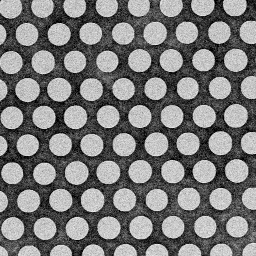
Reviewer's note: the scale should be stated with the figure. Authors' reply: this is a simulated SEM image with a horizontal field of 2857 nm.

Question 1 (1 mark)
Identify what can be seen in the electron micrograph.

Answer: an array of small figures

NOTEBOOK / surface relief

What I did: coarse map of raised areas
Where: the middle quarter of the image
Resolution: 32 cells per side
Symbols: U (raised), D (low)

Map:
UUUUUDDDUUUUUDDDUUUUUDDDUUUUUDDD
DUUUDDDDDUUUDDDDDUUUDDDDDUUUDDDD
DDDDDDDDDDDDDDDDDDDDDDDDDDDDDDDD
DDDDDDDDDDDDDDDDDDDDDDUUDDDDDDDD
UDDDDUUUUDDDDUUUUDDDDUUUUDDDDUUU
UUDDUUUUUUDDUUUUUDDDUUUUUDDDUUUU
UUDDUUUUUUDDUUUUUUDDUUUUUDDDUUUU
UUDDUUUUUDDDDUUUUDDDDUUUUDDDDUUU
UDDDDUUUUDDDDUUUUDDDDDUUDDDDDDUU
DDDDDDDDDDDDDDDDDDDDDDDDDDDDDDDD
DDUDDDDDDDDUDDDDDDUUDDDDDDUUDDDD
DUUUUDDDDUUUUDDDDUUUUDDDDUUUUDDD
UUUUUUDDUUUUUUDDUUUUUUDDUUUUUUDD
UUUUUUDDUUUUUUDDUUUUUUDDUUUUUUDD
UUUUUDDDDUUUUDDDUUUUUDDDDUUUUDDD
DUUUUDDDDDUUUDDDDUUUDDDDDUUUDDDD
DDDDDDDDDDDDDDDDDDDDDDDDDDDDDDDD
DDDDDDDDDDDDDDUUDDDDDDUUUDDDDDUU
UDDDDUUUUDDDDUUUUDDDDUUUUUDDDUUU
UUDDUUUUUUDDUUUUUUDDUUUUUUDDUUUU
UUDDUUUUUUDDUUUUUUDDUUUUUUDDUUUU
UUDDDUUUUUDDDUUUUUDDDUUUUUDDDUUU
UDDDDUUUUDDDDUUUUDDDDDUUUDDDDDUU
DDDDDDDDDDDDDDDDDDDDDDDDDDDDDDDD
DDUUDDDDDDUUDDDDDDUUUDDDDDUUUDDD
DUUUUDDDDUUUUDDDDUUUUUDDDUUUUUDD
UUUUUUDDUUUUUUDDUUUUUUDDUUUUUUDD
UUUUUUDDUUUUUUDDUUUUUUDDUUUUUUDD
DUUUUUDDDUUUUUDDDUUUUDDDDUUUUUDD
DUUUUDDDDUUUUDDDDDUUDDDDDDUUDDDD
DDDDDDDDDDDDDDDDDDDDDDDDDDDDDDDD
DDDDDDUUDDDDDDUUUDDDDDUUDDDDDDUU